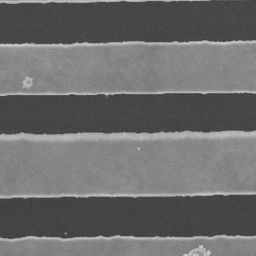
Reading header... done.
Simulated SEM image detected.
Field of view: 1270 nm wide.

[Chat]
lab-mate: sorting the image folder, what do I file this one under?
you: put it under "lines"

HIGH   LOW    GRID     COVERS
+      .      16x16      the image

................
................
................
++++++++++++++++
++++++++++++++++
++++++++++++++++
................
................
++++++++++++++++
++++++++++++++++
++++++++++++++++
++++++++++++++++
................
................
................
++++++++++++++++